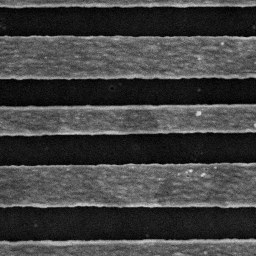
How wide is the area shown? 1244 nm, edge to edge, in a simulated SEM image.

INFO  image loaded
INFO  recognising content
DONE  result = lines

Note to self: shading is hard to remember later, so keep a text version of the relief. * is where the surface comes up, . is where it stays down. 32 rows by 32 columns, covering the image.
********************************
................................
................................
................................
................................
********************************
********************************
********************************
********************************
********************************
................................
................................
................................
********************************
********************************
********************************
*******************************.
................................
................................
................................
...........................*****
********************************
********************************
********************************
********************************
********************************
................................
................................
................................
................................
********************************
********************************